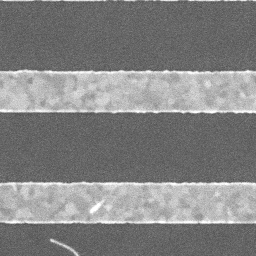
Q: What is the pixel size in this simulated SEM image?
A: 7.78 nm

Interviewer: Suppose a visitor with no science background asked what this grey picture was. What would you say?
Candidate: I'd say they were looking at lines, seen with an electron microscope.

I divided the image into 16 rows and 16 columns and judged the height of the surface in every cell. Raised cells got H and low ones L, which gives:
LLLLLLLLLLLLLLLL
LLLLLLLLLLLLLLLL
LLLLLLLLLLLLLLLL
LLLLLLLLLLLLLLLL
LHHLLLLHLHHLLLLH
HHHHHHHHHHHHHHHH
HHHHHHHHHHHHHHHH
LLLLLLLLLLLLLLLL
LLLLLLLLLLLLLLLL
LLLLLLLLLLLLLLLL
LLLLLLLLLLLLLLLL
HHHHHHHHHHHHHHHH
HHHHHHHHHHHHHHHH
HHHHHHHHHHHHHHHH
LLLLLLLLLLLLLLLL
LLLLLLLLLLLLLLLL